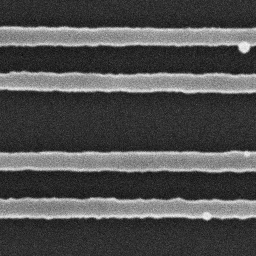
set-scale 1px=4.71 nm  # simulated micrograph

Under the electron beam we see lines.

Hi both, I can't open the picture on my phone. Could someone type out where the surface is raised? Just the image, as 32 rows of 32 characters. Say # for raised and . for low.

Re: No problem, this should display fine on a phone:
................................
................................
................................
###..#..#.......................
################################
################################
..............................#.
................................
................................
################################
################################
...........................###.#
................................
................................
................................
................................
................................
................................
................................
################################
################################
................................
................................
................................
................................
################################
################################
................................
................................
................................
................................
................................